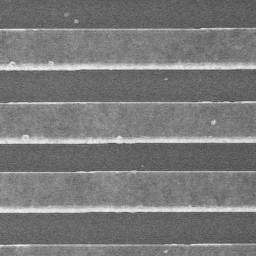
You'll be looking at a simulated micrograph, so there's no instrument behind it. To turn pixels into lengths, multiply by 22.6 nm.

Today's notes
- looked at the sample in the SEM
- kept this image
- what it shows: lines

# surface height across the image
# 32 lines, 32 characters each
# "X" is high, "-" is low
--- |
--------------------------------
--------------------------------
--------------------------------
--------------------------------
XXXXXXXXXXXXXXXXXXXXXXXXXXXXXXXX
XXXXXXXXXXXXXXXXXXXXXXXXXXXXXXXX
XXXXXXXXXXXXXXXXXXXXXXXXXXXXXXXX
XXXXXXXXXXXXXXXXXXXXXXXXXXXXXXXX
XXXXXXXX------------------------
--------------------------------
--------------------------------
--------------------------------
--------------------------------
XXXXXXXXXXXXXXXXXXXXXXXXXXXXXXXX
XXXXXXXXXXXXXXXXXXXXXXXXXXXXXXXX
XXXXXXXXXXXXXXXXXXXXXXXXXXXXXXXX
XXXXXXXXXXXXXXXXXXXXXXXXXXXXXXXX
XXXXXXXXXXXXXXXXXXXXXXXXXXXXXXXX
--------------------------------
--------------------------------
--------------------------------
---------XXXXXXXXXXXXXXXXXXXXXXX
XXXXXXXXXXXXXXXXXXXXXXXXXXXXXXXX
XXXXXXXXXXXXXXXXXXXXXXXXXXXXXXXX
XXXXXXXXXXXXXXXXXXXXXXXXXXXXXXXX
XXXXXXXXXXXXXXXXXXXXXXXXXXXXXXXX
--------------------------------
--------------------------------
--------------------------------
--------------------------------
--------------------------------
XXXXXXXXXXXXXXXXXXXXXXXXXXXXXXXX